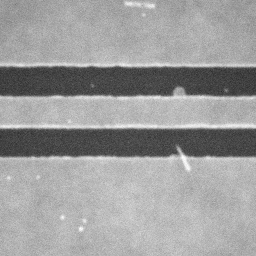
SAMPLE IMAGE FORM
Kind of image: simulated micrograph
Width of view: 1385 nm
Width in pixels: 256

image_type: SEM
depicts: lines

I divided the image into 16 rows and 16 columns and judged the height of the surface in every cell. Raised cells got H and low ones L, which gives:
HHHHHHHHHHHHHHHH
HHHHHHHHHHHHHHHH
HHHHHHHHHHHHHHHH
HHHHHHHHHHHHHHHH
LLLLLLLLLLLLLLLL
LLLLLLLLLLLLLLLL
HHHHHHHHHHHHHHHH
HHHHHHHHHHHHHHHH
LLLLLLLLLLLLLLLL
LLLLLLLLLLLLLLLL
HHHHHHHHHHHHHHHH
HHHHHHHHHHHHHHHH
HHHHHHHHHHHHHHHH
HHHHHHHHHHHHHHHH
HHHHHHHHHHHHHHHH
HHHHHHHHHHHHHHHH